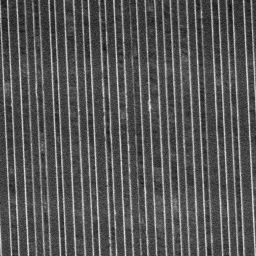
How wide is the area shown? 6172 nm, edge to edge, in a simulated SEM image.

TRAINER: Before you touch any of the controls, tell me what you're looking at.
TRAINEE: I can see parallel lines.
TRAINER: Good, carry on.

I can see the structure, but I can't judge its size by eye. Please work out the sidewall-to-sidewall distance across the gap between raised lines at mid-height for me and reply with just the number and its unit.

172 nm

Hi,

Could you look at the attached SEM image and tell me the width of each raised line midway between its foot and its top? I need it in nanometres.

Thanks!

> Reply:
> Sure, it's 214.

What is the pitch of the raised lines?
389 nm